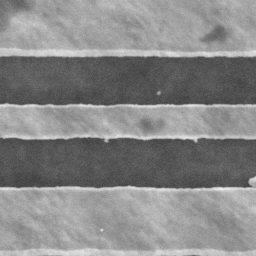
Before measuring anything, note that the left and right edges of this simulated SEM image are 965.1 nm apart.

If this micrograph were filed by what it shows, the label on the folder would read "lines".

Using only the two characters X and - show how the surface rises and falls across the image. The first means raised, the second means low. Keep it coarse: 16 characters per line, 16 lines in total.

XXXXXXXXXXXXXXXX
XXXXXXXXXXXXXXXX
XXXXXXXXXXXXXXXX
----------------
----------------
----------------
X---------------
XXXXXXXXXXXXXXXX
XXXXXXXXXXXXXXXX
----------------
----------------
----------------
XXXXXXXXXXXXXXXX
XXXXXXXXXXXXXXXX
XXXXXXXXXXXXXXXX
XXXXXXXXXXXXXXXX